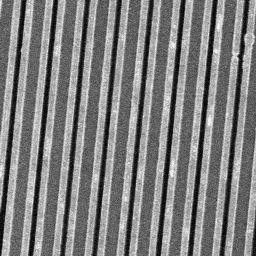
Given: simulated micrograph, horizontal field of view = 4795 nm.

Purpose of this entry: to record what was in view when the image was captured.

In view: parallel lines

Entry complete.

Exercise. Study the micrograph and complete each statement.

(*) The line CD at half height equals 0.126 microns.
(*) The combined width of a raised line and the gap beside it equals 0.295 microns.